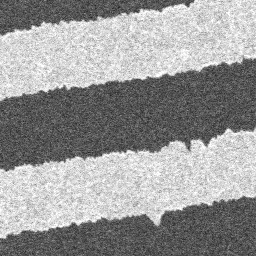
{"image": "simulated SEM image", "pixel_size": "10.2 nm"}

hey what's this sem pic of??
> one or a few lines or trenches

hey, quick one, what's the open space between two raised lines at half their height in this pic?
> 746 nm